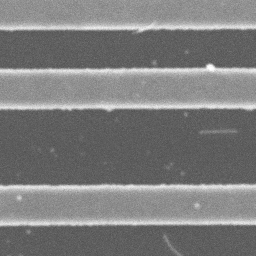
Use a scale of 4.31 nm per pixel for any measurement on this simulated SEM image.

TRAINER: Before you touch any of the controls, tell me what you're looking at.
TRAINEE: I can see lines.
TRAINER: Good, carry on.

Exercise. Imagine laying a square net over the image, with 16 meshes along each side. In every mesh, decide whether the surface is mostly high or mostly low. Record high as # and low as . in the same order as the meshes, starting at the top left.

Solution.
################
################
................
................
################
################
################
................
................
................
................
................
################
################
................
................